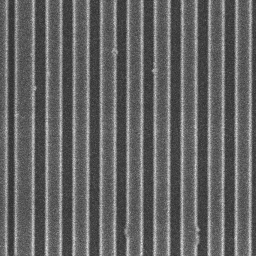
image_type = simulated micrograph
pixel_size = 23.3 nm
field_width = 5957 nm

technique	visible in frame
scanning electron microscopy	parallel lines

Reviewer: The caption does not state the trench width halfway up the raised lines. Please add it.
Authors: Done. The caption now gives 273 nm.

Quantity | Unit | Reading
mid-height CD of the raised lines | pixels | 15.6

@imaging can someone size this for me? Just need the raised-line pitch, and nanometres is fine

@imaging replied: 637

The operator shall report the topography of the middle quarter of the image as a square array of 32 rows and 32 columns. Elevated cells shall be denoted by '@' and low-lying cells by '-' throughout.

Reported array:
--@@@@---@@@@---@@@@---@@@---@@@
--@@@@---@@@@---@@@@--@@@@---@@@
--@@@@---@@@@---@@@@---@@@---@@@
--@@@@---@@@@---@@@@---@@@---@@@
--@@@@---@@@@---@@@@---@@@---@@@
--@@@@---@@@@---@@@@---@@@---@@@
--@@@@---@@@@---@@@@---@@@---@@@
--@@@@---@@@@---@@@@---@@@---@@@
--@@@@---@@@@---@@@@---@@@---@@@
--@@@@---@@@@---@@@@---@@@---@@@
--@@@@---@@@@---@@@@---@@@---@@@
--@@@@---@@@@---@@@@---@@@---@@@
--@@@@---@@@@---@@@@---@@@---@@@
--@@@@---@@@@---@@@@---@@@---@@@
--@@@@---@@@@---@@@@---@@@---@@@
--@@@@---@@@@---@@@@---@@@---@@@
--@@@@---@@@@---@@@@---@@@---@@@
--@@@@---@@@@---@@@@---@@@---@@@
--@@@@---@@@@---@@@@---@@@---@@@
--@@@@---@@@@---@@@@---@@@---@@@
--@@@@---@@@@---@@@@---@@@---@@@
--@@@@---@@@@---@@@@---@@@---@@@
--@@@@---@@@@---@@@@---@@@---@@@
--@@@@---@@@@---@@@@---@@@---@@@
--@@@@---@@@@---@@@@---@@@---@@@
--@@@@---@@@@---@@@@---@@@---@@@
--@@@@---@@@@---@@@@---@@@---@@@
--@@@@---@@@@---@@@@---@@@---@@@
--@@@@---@@@@---@@@@---@@@---@@@
--@@@@---@@@@---@@@@---@@@---@@@
--@@@@---@@@@---@@@@---@@@---@@@
--@@@@---@@@@---@@@@---@@@---@@@